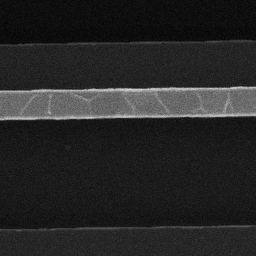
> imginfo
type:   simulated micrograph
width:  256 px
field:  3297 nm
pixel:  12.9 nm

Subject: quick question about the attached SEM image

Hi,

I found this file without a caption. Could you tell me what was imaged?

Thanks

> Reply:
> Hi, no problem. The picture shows lines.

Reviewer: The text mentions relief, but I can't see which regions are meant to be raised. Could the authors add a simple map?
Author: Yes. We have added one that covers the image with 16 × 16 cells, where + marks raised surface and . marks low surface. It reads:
................
................
................
++++++++++++++++
++++++++++++++++
++++++++++++++++
++++++++++++++++
+...............
................
................
................
................
................
................
++++++++++++++++
++++++++++++++++